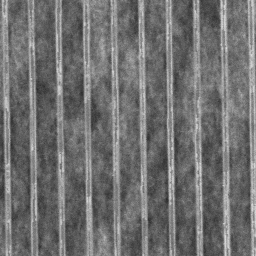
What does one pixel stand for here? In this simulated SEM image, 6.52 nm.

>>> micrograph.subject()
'parallel lines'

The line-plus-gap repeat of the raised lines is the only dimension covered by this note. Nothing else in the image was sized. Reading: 0.178 microns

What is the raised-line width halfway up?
5.87 px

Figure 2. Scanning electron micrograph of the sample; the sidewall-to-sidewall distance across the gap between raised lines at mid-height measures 0.142 µm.